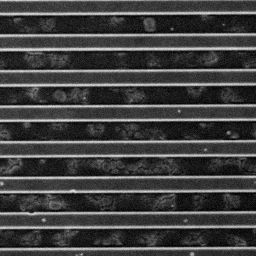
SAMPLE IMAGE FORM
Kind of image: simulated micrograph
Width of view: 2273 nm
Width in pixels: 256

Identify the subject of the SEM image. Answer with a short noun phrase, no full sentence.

parallel lines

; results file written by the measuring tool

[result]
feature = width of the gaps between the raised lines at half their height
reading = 182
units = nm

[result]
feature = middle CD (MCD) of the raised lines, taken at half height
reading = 0.14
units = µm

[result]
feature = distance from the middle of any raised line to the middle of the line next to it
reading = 316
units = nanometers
